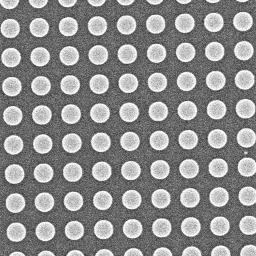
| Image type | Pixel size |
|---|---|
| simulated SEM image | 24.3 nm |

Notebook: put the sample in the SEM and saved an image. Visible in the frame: an array of small figures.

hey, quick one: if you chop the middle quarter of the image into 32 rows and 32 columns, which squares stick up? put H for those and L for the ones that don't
LLLLLLLLLLLLLLLLLLLLLLLLLLLLLLLL
LLLLLLLLLLLLLLLLLLLLLLLLLLLLLLLL
LLLLLLLLLLLLLLLLLLLLLLHHLLLLLHHH
HHHLLLLHHHHLLLHHHHLLLHHHHLLLHHHH
HHHHLLLHHHHLLLHHHHLLLHHHHHLLHHHH
HHHHLLLHHHHLLLHHHHLLLHHHHLLLLHHH
HHHLLLLHHHHLLLLHHHLLLLHHHLLLLLHL
LHLLLLLLLLLLLLLLLLLLLLLLLLLLLLLL
LLLLLLLLLLLLLLLLLLLLLLLLLLLLLLLL
LLLLLLLLLLLLLLLLLLLLLLLLLLLLLLHH
LHHLLLLLHHHLLLLHHHLLLLHHHLLLLHHH
HHHHLLLHHHHLLLHHHHHLLHHHHHLLLHHH
HHHHLLLHHHHLLLHHHHHLLHHHHHLLLHHH
HHHHLLLHHHHLLLHHHHLLLLHHHLLLLHHH
LHHLLLLLHLLLLLLLLLLLLLLLLLLLLLLL
LLLLLLLLLLLLLLLLLLLLLLLLLLLLLLLL
LLLLLLLLLLLLLLLLLLLLLLLLLLLLLLLL
LLLLLLLLHHLLLLLHHHLLLLHHHLLLLHHH
HHHHLLLHHHHLLLHHHHHLLLHHHHLLLHHH
HHHHLLLHHHHLLLHHHHHLLLHHHHLLLHHH
HHHHLLLHHHHLLLLHHHLLLLHHHHLLLHHH
HHHHLLLLHHHLLLLLHLLLLLLLLLLLLLLL
LLLLLLLLLLLLLLLLLLLLLLLLLLLLLLLL
LLLLLLLLLLLLLLLLLLLLLLLLLLLLLLLL
LLLLLLLLLLLLLLLLHHLLLLLHHLLLLLHH
HHHHLLLLHHHLLLLHHHHLLLHHHHLLLHHH
HHHHLLLHHHHHLLHHHHHLLLHHHHLLLHHH
HHHHLLLHHHHHLLLHHHHLLLHHHHLLLHHH
HHHHLLLLHHHLLLLHHHLLLLLHHLLLLLLL
LLLLLLLLLLLLLLLLLLLLLLLLLLLLLLLL
LLLLLLLLLLLLLLLLLLLLLLLLLLLLLLLL
LLLLLLLLLLLLLLLLLLLLLLLHHLLLLLHH